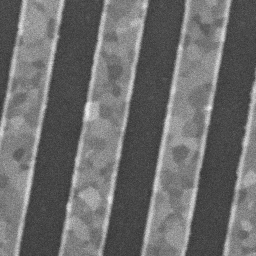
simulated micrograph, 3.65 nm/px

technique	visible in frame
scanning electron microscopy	one or a few lines or trenches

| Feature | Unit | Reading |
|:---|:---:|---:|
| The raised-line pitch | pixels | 81.5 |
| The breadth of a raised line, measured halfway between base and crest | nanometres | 144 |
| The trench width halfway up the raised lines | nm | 154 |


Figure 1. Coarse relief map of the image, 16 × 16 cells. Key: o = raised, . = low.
.ooo...oo...oo..
.ooo..ooo...oo..
.oo...ooo..ooo..
.oo...ooo..ooo..
.oo...oo...ooo..
.oo...oo...oo...
ooo...oo...oo...
ooo..ooo..ooo...
oo...ooo..ooo..o
oo...oo...ooo..o
oo...oo...oo...o
oo...oo...oo...o
oo..ooo...oo...o
o...ooo..ooo...o
o...ooo..ooo..oo
o...oo...ooo..oo